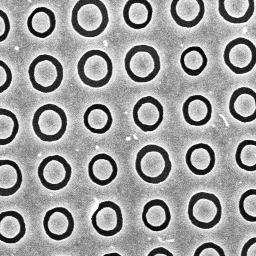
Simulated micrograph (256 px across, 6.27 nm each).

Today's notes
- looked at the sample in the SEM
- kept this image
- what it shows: a regular array of ring-shaped grooves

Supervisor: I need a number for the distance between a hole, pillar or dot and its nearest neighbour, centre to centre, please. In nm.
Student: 309